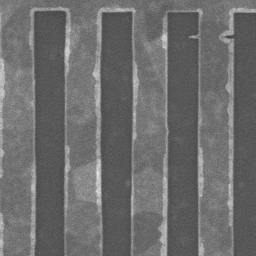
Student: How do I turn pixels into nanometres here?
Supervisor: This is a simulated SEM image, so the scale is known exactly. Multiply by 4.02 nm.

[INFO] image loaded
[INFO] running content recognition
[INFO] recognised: one or a few lines or trenches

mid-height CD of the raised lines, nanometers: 138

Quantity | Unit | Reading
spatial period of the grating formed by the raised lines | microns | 0.266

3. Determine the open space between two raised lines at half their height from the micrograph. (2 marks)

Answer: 126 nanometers